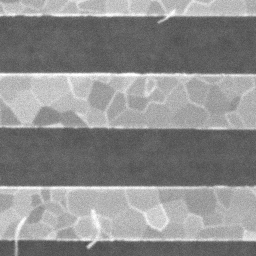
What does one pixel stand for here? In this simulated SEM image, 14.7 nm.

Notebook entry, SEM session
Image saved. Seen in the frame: lines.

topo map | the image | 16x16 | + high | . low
++++++++++++++++
................
................
................
................
++++++++++++++++
++++++++++++++++
++++++++++++++++
................
................
................
................
++++++++++++++++
++++++++++++++++
++++++++++++++++
................